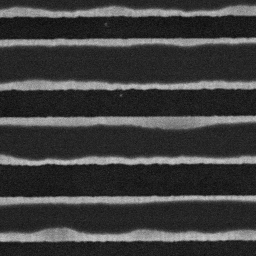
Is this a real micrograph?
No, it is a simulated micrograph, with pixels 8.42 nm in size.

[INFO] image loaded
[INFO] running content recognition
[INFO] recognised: lines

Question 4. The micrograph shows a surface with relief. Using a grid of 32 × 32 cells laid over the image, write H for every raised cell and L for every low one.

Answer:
HHHHHHHHHHHHHHHHHHHHHHHHHHHHHHHH
HHHHHHHHHHHHHHHHHHHHHHHHHHHHHLLL
LLLLLLLLLLLLLLLLLLLLLLLLLLLLLLLL
LLLLLLLLLLLLLLLLLLLLLLLLLLLLLLLL
LLLLLLLLLLLLLLLLLLLLLLLLLLLLLLLL
HHHHHHHHHHHHHHHHHHHHHHHHHHHHHHHH
HHHHHHHHHHHHHHHHHHHHHHHHHHHHHHHH
HHHHHHHHHHHHHHHHHHHHHHHHHHHHHHHH
HHHHHHHHHHHHHHHHHHHHHHHHHHHHHHHH
HHHHHHHHHHHHHHHHHHHHHHHHHHHHHHHH
HHHHHHHHHHHHHHHHHHHHHHHHHHHHHHHH
LLLLLLLLLLLLLLLLLLLLLLLLLLLLLLLL
LLLLLLLLLLLLLLLLLLLLLLLLLLLLLLLL
LLLLLLLLLLLLLLLLLLLLLLLLLLLLLLLL
LLLLLLLLLLLLLLLLLLLLLLLLLLLLLLLL
HHHHHHHHHHHHHHHHHHHHHHHHHHHHHHHH
HHHHHHHHHHHHHHHHHHHHHHHHHHHHHHHH
HHHHHHHHHHHHHHHHHHHHHHHHHHHHHHHH
HHHHHHHHHHHHHHHHHHHHHHHHHHHHHHHH
HHHHHHHHHHHHHHHHHHHHHHHHHHHHHHHH
LLLLLLLLLLLLLLLLLLLLLLLLLLLLLLLL
LLLLLLLLLLLLLLLLLLLLLLLLLLLLLLLL
LLLLLLLLLLLLLLLLLLLLLLLLLLLLLLLL
LLLLLLLLLLLLLLLLLLLLLLLLLLLLLLLL
LLLLLLLLLLLLLLLLLLLLLLLLLLLLLLLL
HHHHHHHHHHHHHHHHHHHHHHHHHHHHHHHH
HHHHHHHHHHHHHHHHHHHHHHHHHHHHHHHH
HHHHHHHHHHHHHHHHHHHHHHHHHHHHHHHH
HHHHHHHHHHHHHHHHHHHHHHHHHHHHHHHH
HHHHHHHLHHHHHHHHHHHHHHHHHHHHHLLH
LLLLLLLLLLLLLLLLLLLLLLLLLLLLLLLL
LLLLLLLLLLLLLLLLLLLLLLLLLLLLLLLL